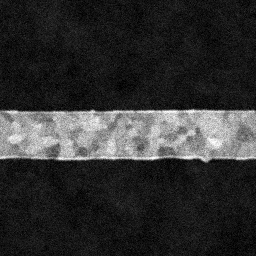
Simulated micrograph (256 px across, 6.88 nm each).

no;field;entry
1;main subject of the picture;one or a few lines or trenches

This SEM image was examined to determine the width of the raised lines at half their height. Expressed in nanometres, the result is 316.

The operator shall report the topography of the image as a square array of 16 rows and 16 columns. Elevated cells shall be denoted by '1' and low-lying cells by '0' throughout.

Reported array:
0000000000000000
0000000000000000
0000000000000000
0000000000000000
0000000000000000
0000000000000000
0000000000000000
1111111111111111
1111111111111111
1111111111111111
0000000000000000
0000000000000000
0000000000000000
0000000000000000
0000000000000000
0000000000000000